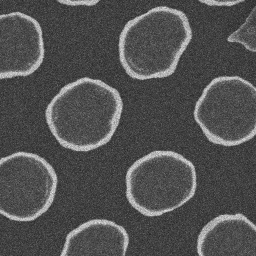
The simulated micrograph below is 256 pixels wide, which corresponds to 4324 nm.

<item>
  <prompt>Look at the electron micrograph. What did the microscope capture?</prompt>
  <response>raised bodies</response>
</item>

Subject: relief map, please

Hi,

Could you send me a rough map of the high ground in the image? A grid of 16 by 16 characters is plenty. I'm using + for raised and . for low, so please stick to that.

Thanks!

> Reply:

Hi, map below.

................
++......++++....
+++.....++++....
+++.....+++.....
++......++......
....+++......+++
...++++.....++++
...++++.....++++
....+++......+++
................
+++.....++++....
+++.....++++....
+++.....++++....
.+..............
.....+++.....+++
....++++....++++